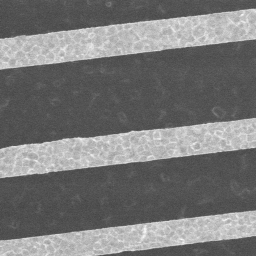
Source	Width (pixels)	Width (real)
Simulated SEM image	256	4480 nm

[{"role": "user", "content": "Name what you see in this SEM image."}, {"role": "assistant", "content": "one or a few lines or trenches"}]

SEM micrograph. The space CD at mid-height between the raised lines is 1.11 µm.